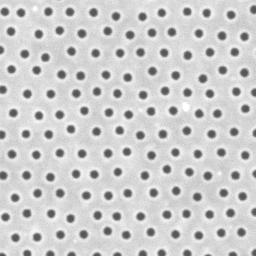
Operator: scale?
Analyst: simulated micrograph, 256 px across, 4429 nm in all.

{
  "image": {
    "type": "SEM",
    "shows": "a regular array of holes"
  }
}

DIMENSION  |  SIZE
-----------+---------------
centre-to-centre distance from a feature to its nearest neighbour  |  344 nanometres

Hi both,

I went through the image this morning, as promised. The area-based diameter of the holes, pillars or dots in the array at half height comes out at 167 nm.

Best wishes